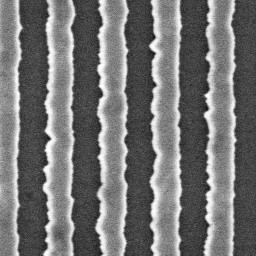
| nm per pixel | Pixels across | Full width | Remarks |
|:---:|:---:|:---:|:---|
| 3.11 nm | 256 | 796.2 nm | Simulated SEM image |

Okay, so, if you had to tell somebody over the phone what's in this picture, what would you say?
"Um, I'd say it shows lines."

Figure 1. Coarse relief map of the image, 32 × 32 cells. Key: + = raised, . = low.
++....+++...++++...+++....+++...
++....+++...++++...+++....+++...
++....+++....+++...++++...+++...
+++...+++....++....++++...+++...
++....+++...++++...++++...+++...
++....+++....+++...+++....+++...
+++...+++...++++...+++....+++...
++....+++....+++...+++....+++...
++....+++...++++...+++....+++...
++....+++....+++...+++....+++...
++....+++...++++...+++....+++...
++....+++....+++...+++....+++...
++....+++....+++...+++....+++...
++....+++...++++...+++....+++...
++....+++...++++...+++....+++...
++....+++....+++...+++....+++...
++....+++....+++...+++....+++...
++....+++...++++...+++....+++...
++....+++....+++...+++....+++...
++....+++...++++....+++...+++...
++....+++....+++...+++....+++...
++....+++....+++...++++...+++...
++....+++....+++...++++...+++...
++...++++....+++...++++...+++...
++....+++...++++...++++...+++...
++....+++....+++...+++....+++...
++....+++....+++...+++....+++...
++....+++...++++...+++....+++...
++....+++...+++....+++....+++...
++....+++...+++....+++....+++...
++....+++....+++...+++....+++...
++....+++....++....+++....+++...